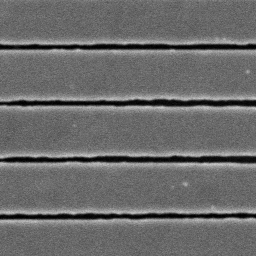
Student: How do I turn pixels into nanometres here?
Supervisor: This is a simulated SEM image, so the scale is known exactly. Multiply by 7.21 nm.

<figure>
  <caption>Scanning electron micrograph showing lines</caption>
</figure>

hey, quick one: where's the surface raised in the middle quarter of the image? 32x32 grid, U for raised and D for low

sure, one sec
UUUUUUUUUUUUUUUUUUUUUUUUUUUUUUUU
UUUUUUUUUUUUUUUUUUUUUUUUUUUUUUUU
UUUUUUUUUUUUUUUUUUUUUUUUUUUUUUUU
UUUUUUUUUUUUUUUUUUUUUUUUUUUUUUUU
UUUUUUUUUUUUUUUUUUUUUUUUUUUUUUUU
UUUUUUUUUUUUUUUUUUUUUUUUUUUUUUUU
UUUUUUUUUUUUUUUUUUUUUUUUUUUUUUUU
UUUUUUUUUUUUUUUUUUUUUUUUUUUUUUUU
UUUUUUUUUUUUUUUUUUUUUUUUUUUUUUUU
DDDDDDDDDDDDDDDDDDDDDDDDDDDDDDDD
DDDDDDDDDDDDDDDDDDDDDDDDDDDDDDDD
UUUUUUUUUUUUUUUUUUUUUUUUUUUUUUUU
UUUUUUUUUUUUUUUUUUUUUUUUUUUUUUUU
UUUUUUUUUUUUUUUUUUUUUUUUUUUUUUUU
UUUUUUUUUUUUUUUUUUUUUUUUUUUUUUUU
UUUUUUUUUUUUUUUUUUUUUUUUUUUUUUUU
UUUUUUUUUUUUUUUUUUUUUUUUUUUUUUUU
UUUUUUUUUUUUUUUUUUUUUUUUUUUUUUUU
UUUUUUUUUUUUUUUUUUUUUUUUUUUUUUUU
UUUUUUUUUUUUUUUUUUUUUUUUUUUUUUUU
UUUUUUUUUUUUUUUUUUUUUUUUUUUUUUUU
UUUUUUUUUUUUUUUUUUUUUUUUUUUUUUUU
UUUUUUUUUUUUUUUUUUUUUUUUUUUUUUUU
DDDDDDDDDDDDDDDDDDDDDDDDDDDDDDDD
DDDDDDDDDDDDDDDDDDDDDDDDDDDDDDDD
UUUUUUUUUUUUUUUUUUUUUUUUUUUUUUUU
UUUUUUUUUUUUUUUUUUUUUUUUUUUUUUUU
UUUUUUUUUUUUUUUUUUUUUUUUUUUUUUUU
UUUUUUUUUUUUUUUUUUUUUUUUUUUUUUUU
UUUUUUUUUUUUUUUUUUUUUUUUUUUUUUUU
UUUUUUUUUUUUUUUUUUUUUUUUUUUUUUUU
UUUUUUUUUUUUUUUUUUUUUUUUUUUUUUUU